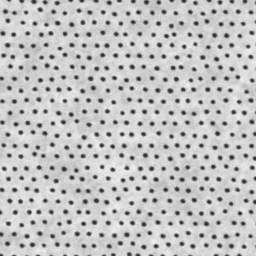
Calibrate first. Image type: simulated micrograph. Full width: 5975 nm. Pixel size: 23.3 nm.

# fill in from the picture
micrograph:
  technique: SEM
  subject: a regular array of holes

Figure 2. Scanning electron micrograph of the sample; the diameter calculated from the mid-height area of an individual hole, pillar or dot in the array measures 118 nm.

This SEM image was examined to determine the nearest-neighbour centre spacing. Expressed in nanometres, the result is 253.